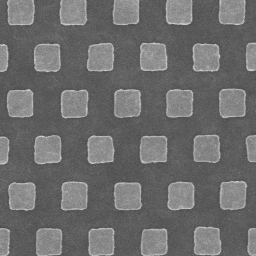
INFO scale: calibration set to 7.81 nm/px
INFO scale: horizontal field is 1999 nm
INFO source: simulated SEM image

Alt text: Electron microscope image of a regular array of raised bodies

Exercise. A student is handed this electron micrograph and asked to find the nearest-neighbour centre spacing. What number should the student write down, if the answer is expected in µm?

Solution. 0.41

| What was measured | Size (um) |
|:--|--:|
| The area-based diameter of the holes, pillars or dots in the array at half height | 0.23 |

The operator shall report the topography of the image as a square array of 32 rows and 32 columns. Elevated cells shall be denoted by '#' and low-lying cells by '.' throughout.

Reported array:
.###....###...###....###....###.
.###....###...###....###...####.
.###....###...###....###...####.
................................
................................
............##....##...........#
#...###....###....###...###....#
#...###....###....###...###....#
#...###....###....###...###....#
................................
................................
.###....###....##....###....##..
.###....###...####...###...####.
.###....###...####...###...####.
..##....###....##....###....##..
................................
................................
#...####...###....###...###....#
#...####...###....###...###....#
#...####...###....###...###....#
................................
................................
................................
.###....###...####...###....###.
.###....###...####...###....###.
.###....###...####...###....###.
................................
................................
.........................##.....
#....###...###....###...###....#
#....###...###....###...####...#
#....###...###....###...###....#